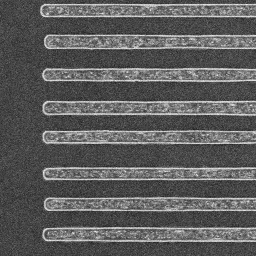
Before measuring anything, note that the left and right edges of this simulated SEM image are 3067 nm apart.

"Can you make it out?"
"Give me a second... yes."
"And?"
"parallel lines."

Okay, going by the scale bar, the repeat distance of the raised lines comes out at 383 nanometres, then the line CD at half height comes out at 142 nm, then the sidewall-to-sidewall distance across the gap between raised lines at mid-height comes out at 0.223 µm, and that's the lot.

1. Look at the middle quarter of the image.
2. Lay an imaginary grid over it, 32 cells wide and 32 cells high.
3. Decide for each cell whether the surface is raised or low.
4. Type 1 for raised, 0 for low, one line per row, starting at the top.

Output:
00000000000000000000000000000000
00001111111111111111111111111111
11111111111111111111111111111111
11111111111111111111111111111111
00000000000000000000000000000000
00000000000000000000000000000000
00000000000000000000000000000000
00000000000000000000000000000000
00000000000000000000000000000000
00000000000000000000000000000000
11111111111111111111111111111111
11111111111111111111111111111111
10000000000000000100000000000011
00000000000000000000000000000000
00000000000000000000000000000000
00000000000000000000000000000000
00000000000000000000000000000000
11111111111111111111111111111111
11111111000111111111111111111111
11111111111110111111111111111111
00000000000000000000000000000000
00000000000000000000000000000000
00000000000000000000000000000000
00000000000000000000000000000000
00000000000000000000000000000000
00000000000000000000000000000000
11111111111111111111111111111111
11111111111111111111111111111111
11111111111111111111111111111111
00000000000000000000000000000000
00000000000000000000000000000000
00000000000000000000000000000000